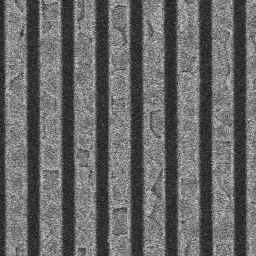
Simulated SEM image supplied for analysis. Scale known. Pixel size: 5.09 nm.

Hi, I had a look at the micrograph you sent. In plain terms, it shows parallel lines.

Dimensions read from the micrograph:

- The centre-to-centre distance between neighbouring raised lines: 175 nm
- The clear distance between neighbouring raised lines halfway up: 64.8 nanometers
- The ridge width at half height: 109 nanometres